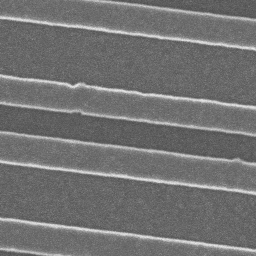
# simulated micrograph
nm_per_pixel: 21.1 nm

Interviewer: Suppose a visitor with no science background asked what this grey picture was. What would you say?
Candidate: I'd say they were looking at one or a few lines or trenches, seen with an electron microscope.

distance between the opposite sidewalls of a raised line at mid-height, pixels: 29.3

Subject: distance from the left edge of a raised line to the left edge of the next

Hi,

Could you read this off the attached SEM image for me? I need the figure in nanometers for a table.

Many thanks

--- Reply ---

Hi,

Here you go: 1450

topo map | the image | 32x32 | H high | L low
HHHHHHHHHHHHHHHHLLLLLLLLLLLLLLLL
HHHHHHHHHHHHHHHHHHHHHHHHLLLLLLLL
LLLHHHHHHHHHHHHHHHHHHHHHHHHHHHHH
LLLLLLLLLLLHHHHHHHHHHHHHHHHHHHHH
LLLLLLLLLLLLLLLLLLLHHHHHHHHHHHHH
LLLLLLLLLLLLLLLLLLLLLLLLLLLHHHHH
LLLLLLLLLLLLLLLLLLLLLLLLLLLLLLLL
LLLLLLLLLLLLLLLLLLLLLLLLLLLLLLLL
LLLLLLLLLLLLLLLLLLLLLLLLLLLLLLLL
LLLLLLLLLLLLLLLLLLLLLLLLLLLLLLLL
HHHHHHHHLLLLLLLLLLLLLLLLLLLLLLLL
HHHHHHHHHHHHHHHHLLLLLLLLLLLLLLLL
HHHHHHHHHHHHHHHHHHHHHHHHHLLLLLLL
LLLLLHHHHHHHHHHHHHHHHHHHHHHHHHHH
LLLLLLLLLLLLLHHHHHHHHHHHHHHHHHHH
LLLLLLLLLLLLLLLLLLLLLHHHHHHHHHHH
LLLLLLLLLLLLLLLLLLLLLLLLLLLLLHHH
HHHHHHHHLLLLLLLLLLLLLLLLLLLLLLLL
HHHHHHHHHHHHHHHHLLLLLLLLLLLLLLLL
HHHHHHHHHHHHHHHHHHHHHHHHLLLLLLLL
LLHHHHHHHHHHHHHHHHHHHHHHHHHHHHHH
LLLLLLLLLLHHHHHHHHHHHHHHHHHHHHHH
LLLLLLLLLLLLLLLLLLHHHHHHHHHHHHHH
LLLLLLLLLLLLLLLLLLLLLLLLLLLHHHHH
LLLLLLLLLLLLLLLLLLLLLLLLLLLLLLLL
LLLLLLLLLLLLLLLLLLLLLLLLLLLLLLLL
LLLLLLLLLLLLLLLLLLLLLLLLLLLLLLLL
HHLLLLLLLLLLLLLLLLLLLLLLLLLLLLLL
HHHHHHHHHHLLLLLLLLLLLLLLLLLLLLLL
HHHHHHHHHHHHHHHHHHLLLLLLLLLLLLLL
HHHHHHHHHHHHHHHHHHHHHHHHHHLLLLLL
LLLHHHHHHHHHHHHHHHHHHHHHHHHHHHHH